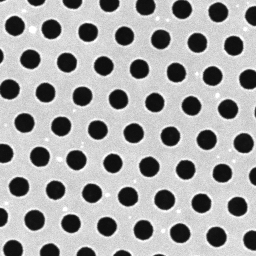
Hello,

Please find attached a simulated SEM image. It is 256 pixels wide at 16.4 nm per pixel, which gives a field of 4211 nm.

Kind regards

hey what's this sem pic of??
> a regular array of holes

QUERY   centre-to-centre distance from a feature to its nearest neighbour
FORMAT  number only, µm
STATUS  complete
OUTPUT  0.6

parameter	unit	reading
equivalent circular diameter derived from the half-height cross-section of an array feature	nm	338